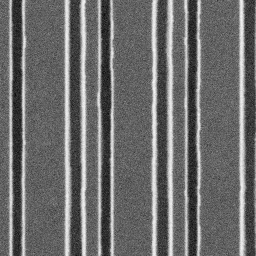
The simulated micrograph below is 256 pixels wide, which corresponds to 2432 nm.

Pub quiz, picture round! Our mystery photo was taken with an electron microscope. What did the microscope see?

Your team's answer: lines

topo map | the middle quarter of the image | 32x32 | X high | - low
X----XXXX---XXXXXXXXXXX----XXX--
X----XXXX---XXXXXXXXXXX----XXX--
X----XXXX---XXXXXXXXXXX----XXX--
X----XXXX---XXXXXXXXXXX----XXX--
X----XXXX---XXXXXXXXXXX----XXX--
X----XXXX---XXXXXXXXXXX----XXX--
X----XXXX---XXXXXXXXXXX----XXX--
X----XXXX---XXXXXXXXXXX----XXX--
X----XXXX---XXXXXXXXXXX----XXX--
X----XXXX---XXXXXXXXXXX----XXX--
X----XXXX---XXXXXXXXXXX----XXX--
X----XXXX---XXXXXXXXXX-----XXX--
X----XXXX---XXXXXXXXXXX----XXX--
X----XXXX---XXXXXXXXXXX----XXX--
X----XXXX---XXXXXXXXXXX----XXX--
X----XXXX---XXXXXXXXXXX----XXX--
X----XXXX---XXXXXXXXXXX----XXX--
X----XXXX---XXXXXXXXXXX----XXX--
X----XXXX---XXXXXXXXXXX----XXX--
X----XXXX---XXXXXXXXXXX----XXX--
X----XXXX---XXXXXXXXXXX----XXX--
X----XXXX---XXXXXXXXXXX----XXX--
X----XXXX---XXXXXXXXXXX----XXX--
X----XXXX---XXXXXXXXXXX----XXX--
X----XXXX---XXXXXXXXXXX----XXX--
X----XXXX---XXXXXXXXXX-----XXX--
X----XXXX---XXXXXXXXXXX----XXX--
X----XXXX---XXXXXXXXXXX----XXX--
X----XXXX---XXXXXXXXXXX----XXX--
X----XXXX---XXXXXXXXXXX----XXX--
X----XXXX---XXXXXXXXXXX----XXX--
X----XXXX---XXXXXXXXXXX----XXX--